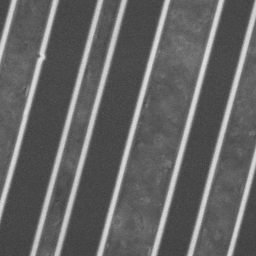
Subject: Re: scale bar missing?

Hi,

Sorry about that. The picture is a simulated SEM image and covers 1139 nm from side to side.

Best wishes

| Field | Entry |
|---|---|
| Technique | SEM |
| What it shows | one or a few lines or trenches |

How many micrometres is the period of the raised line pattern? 0.354